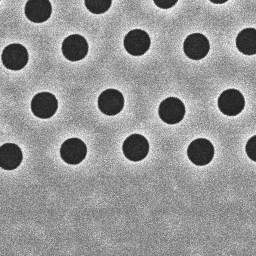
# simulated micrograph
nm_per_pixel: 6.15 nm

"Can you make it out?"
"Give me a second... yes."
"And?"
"a regular array of holes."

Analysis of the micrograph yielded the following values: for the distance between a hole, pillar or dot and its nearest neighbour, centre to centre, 334 nanometres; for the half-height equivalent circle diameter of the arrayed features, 171 nanometres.